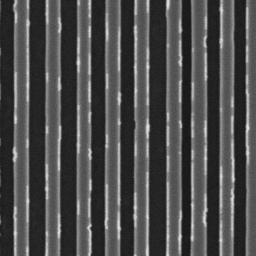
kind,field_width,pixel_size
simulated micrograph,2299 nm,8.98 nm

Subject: parallel lines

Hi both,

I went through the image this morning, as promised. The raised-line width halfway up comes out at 128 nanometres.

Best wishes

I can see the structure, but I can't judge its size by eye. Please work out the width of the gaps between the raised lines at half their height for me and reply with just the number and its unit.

0.128 microns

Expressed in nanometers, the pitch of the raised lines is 263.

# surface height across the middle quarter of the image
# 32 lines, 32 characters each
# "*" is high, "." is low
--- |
...****...****....***.....***...
...****...****....***.....***...
...****....***....***.....***...
...****....***....***.....***...
...****....***....***.....***...
...****....***....***.....***...
...****....***....***.....***...
...****....***....***.....***...
...****....***....***.....***...
...****....***....***.....***...
...****....***....***.....***...
...****....***....***.....***...
...****....***....***.....***...
...****....***....***.....***...
...****....***....***.....***...
...****....***....***.....***...
...****....***....***.....***...
...****....***....***.....***...
...****....***....***.....***...
...****....***....***.....***...
...****...****....***.....***...
...****....***....***.....***...
...****...****....***.....***...
...****...****....***.....***...
...****...****....***.....***...
...****...****....***.....***...
...****...****....***.....***...
...****...****....***.....***...
...****...****....***.....***...
...****...****....***.....***...
...****...****....***.....***...
...****...****....***.....***...